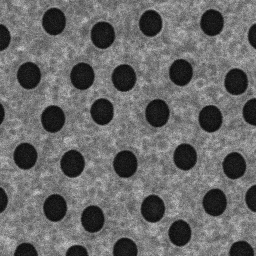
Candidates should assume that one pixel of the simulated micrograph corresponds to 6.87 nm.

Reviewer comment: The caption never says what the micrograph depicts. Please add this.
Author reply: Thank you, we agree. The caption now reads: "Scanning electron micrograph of a regular array of holes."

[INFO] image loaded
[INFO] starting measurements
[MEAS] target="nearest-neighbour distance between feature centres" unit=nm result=315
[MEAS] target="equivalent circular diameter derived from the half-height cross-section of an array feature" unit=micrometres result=0.184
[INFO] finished